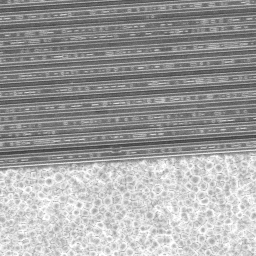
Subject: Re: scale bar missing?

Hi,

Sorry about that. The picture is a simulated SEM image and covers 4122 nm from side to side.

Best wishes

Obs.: parallel lines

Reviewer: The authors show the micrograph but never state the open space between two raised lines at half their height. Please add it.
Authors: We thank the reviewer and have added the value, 80.3 nanometres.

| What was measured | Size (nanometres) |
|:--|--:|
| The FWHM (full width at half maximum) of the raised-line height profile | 62.2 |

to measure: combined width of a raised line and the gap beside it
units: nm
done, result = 135